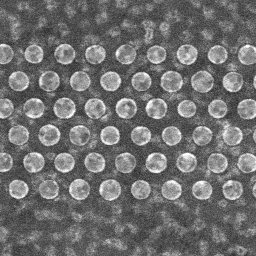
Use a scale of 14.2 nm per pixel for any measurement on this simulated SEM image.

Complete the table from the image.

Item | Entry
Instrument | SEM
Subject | a regular array of raised bodies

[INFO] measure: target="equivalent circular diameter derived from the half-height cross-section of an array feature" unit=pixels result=19.6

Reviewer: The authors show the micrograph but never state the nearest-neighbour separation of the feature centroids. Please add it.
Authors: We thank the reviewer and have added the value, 431 nm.